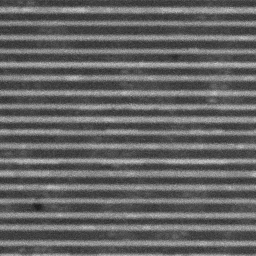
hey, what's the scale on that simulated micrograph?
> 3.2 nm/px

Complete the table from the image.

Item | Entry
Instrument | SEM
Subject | parallel lines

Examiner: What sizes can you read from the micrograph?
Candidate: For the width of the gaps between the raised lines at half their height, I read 30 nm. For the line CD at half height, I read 0.012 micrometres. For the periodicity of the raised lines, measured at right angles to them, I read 43.9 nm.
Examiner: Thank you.